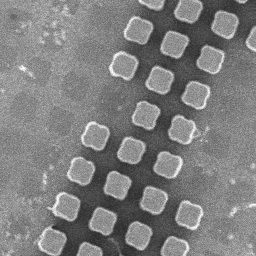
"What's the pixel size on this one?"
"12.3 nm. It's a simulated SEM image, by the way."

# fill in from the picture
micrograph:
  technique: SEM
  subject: a regular array of raised bodies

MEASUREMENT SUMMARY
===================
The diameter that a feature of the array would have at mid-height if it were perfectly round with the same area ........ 318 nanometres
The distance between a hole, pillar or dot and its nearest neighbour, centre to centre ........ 0.466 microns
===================